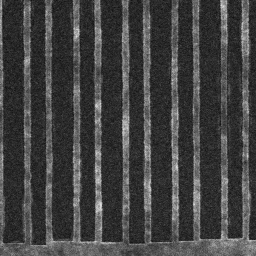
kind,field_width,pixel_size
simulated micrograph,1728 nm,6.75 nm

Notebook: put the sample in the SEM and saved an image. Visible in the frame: parallel lines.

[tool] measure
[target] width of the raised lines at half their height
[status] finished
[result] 38.8 nm